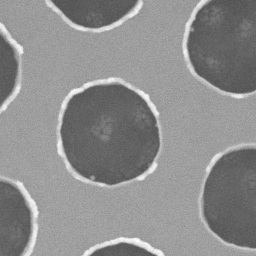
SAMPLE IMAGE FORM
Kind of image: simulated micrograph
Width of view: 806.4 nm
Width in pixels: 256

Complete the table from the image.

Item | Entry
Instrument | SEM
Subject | holes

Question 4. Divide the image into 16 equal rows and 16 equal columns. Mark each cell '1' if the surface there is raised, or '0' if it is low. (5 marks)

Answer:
1111000011111000
1111100111110000
1111111111110000
0111111111110000
0111111111110000
0111110011111100
1111000001111111
1111000000111111
1111000000111111
1111000000111100
1111100001111000
0111111111111000
0011111111111000
0011111111111000
0011111111111000
0011110001111111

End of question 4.